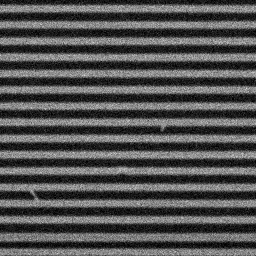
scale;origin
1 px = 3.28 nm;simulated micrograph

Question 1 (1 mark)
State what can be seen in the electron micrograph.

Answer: parallel lines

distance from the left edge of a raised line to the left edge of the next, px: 16.3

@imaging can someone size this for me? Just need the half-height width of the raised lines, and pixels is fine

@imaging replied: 6.62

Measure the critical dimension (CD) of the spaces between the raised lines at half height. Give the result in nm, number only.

31.2